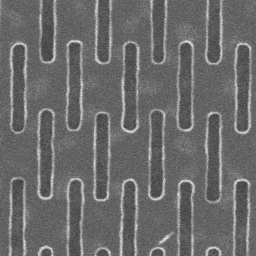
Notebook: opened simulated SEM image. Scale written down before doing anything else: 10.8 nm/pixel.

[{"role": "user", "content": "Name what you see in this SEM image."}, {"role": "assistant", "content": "a regular array of holes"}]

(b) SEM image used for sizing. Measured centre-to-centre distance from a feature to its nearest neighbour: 605 nm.